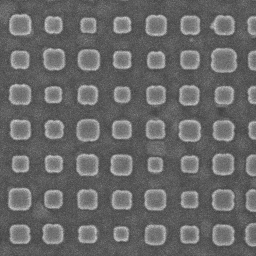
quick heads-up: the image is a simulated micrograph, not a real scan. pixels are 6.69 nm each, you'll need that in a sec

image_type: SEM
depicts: a regular array of raised bodies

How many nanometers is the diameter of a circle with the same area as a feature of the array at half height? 138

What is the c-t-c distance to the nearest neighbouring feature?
225 nm